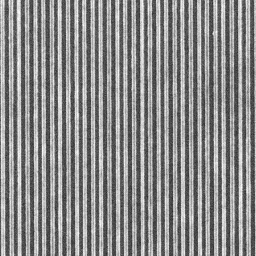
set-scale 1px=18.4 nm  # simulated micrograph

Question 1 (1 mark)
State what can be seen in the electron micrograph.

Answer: parallel lines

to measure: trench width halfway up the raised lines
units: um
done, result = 0.0872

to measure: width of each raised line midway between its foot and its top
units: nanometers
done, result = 68.8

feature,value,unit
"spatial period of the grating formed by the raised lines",150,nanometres